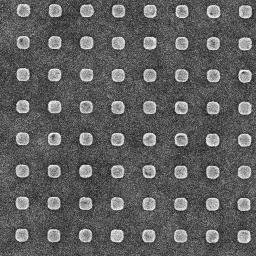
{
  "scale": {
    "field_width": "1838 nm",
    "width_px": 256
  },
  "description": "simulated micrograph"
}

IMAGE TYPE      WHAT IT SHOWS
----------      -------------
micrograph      a regular array of raised bodies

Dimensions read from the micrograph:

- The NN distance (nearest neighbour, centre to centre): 227 nm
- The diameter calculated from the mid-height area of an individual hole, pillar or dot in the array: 0.0923 microns